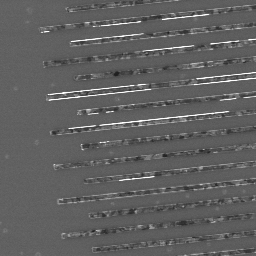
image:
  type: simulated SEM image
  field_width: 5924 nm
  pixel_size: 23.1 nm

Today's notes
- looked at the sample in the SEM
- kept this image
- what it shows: parallel lines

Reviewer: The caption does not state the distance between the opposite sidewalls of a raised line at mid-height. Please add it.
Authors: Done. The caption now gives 0.109 µm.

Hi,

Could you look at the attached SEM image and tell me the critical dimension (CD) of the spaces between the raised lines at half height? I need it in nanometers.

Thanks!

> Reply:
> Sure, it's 285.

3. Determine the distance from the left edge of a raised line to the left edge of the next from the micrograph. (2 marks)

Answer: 400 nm